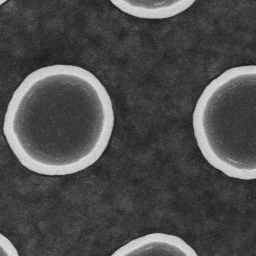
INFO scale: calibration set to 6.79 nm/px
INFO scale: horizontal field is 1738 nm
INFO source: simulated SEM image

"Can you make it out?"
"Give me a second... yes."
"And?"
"raised bodies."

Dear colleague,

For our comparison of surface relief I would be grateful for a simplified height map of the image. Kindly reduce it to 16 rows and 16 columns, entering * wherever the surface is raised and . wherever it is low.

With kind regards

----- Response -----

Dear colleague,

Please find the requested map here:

........***.....
................
................
................
...**..........*
.*****.......***
.******......***
.******.....****
.******......***
.*****.......***
...*..........**
................
................
................
................
*.......****....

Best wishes